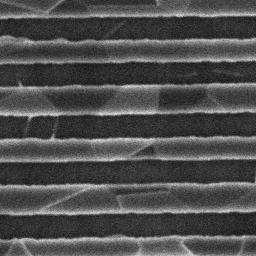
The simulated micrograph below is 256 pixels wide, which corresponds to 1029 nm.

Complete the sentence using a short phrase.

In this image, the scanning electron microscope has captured lines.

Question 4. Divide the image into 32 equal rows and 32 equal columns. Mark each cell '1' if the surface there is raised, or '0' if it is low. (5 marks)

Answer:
11111111111111111111111111111111
11111111111111111111111111111111
00000000000000000000000000000000
00000000000000000000000000000000
00000000000000000000000000000000
11111111111111111111111111111111
11111111111111111111111111111111
11111111111111111111111111111111
00000000000000000000000000000000
00000000000000000000000000000000
00000000000000000000000000110111
11111111111111111111111111111111
11111111111111111111111111111111
11111111111111111111111111111111
00010000000000000000000000000000
00000000000000000000000000000000
00000000000000000000000000000000
11111111111111111111111111111111
11111111111111111111111111111111
11111111111111111111111111111111
00000000000000000000000000000000
00000000000000000000000000000000
00000000000000000000000000000000
11111111111111111111111111111111
11111111111111111111111111111111
11111111111111111111111111111111
11111111111111111111110000000000
00000000000000000000000000000000
00000000000000000000000000000000
00000000000000000000000000000000
11111111111111111111111111111111
11111111111111111111111111111111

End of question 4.